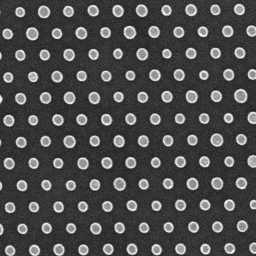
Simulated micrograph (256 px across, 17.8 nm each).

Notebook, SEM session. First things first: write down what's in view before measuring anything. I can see a regular array of raised bodies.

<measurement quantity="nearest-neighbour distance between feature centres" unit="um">0.43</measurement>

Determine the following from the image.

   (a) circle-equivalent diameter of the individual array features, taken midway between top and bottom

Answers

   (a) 184 nm